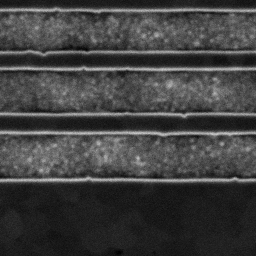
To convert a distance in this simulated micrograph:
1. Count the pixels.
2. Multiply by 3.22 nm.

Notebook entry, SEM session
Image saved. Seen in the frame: parallel lines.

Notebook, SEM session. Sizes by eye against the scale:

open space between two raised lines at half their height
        143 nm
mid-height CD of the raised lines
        60.8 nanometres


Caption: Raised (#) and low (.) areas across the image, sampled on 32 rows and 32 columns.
################################
................................
................................
................................
................................
................................
...#.....#.##..........####...##
################################
################################
................................
................................
................................
................................
................................
################################
################################
################################
................................
................................
................................
................................
................................
.....##############.....########
################################
################################
################################
################################
################################
################################
################################
################################
################################